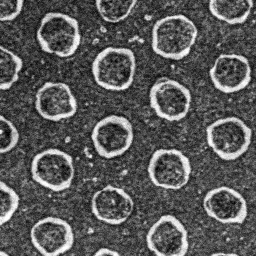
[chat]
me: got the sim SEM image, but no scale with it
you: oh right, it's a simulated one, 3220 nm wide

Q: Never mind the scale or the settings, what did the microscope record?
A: a regular array of raised bodies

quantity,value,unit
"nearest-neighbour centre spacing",826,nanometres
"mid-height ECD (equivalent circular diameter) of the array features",36.8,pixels